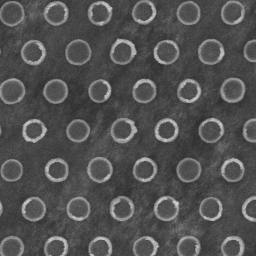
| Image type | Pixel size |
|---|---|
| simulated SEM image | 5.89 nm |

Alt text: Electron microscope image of a regular array of raised bodies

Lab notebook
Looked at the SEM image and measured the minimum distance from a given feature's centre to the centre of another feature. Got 259 nm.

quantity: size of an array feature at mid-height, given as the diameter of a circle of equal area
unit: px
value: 23